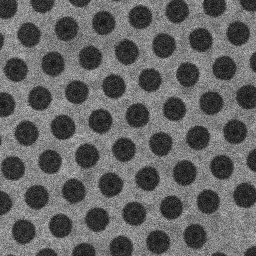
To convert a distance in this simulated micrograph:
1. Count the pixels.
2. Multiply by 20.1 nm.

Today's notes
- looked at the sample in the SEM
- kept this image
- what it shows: a regular array of ring-shaped grooves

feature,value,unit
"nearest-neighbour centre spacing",741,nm